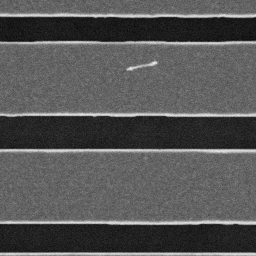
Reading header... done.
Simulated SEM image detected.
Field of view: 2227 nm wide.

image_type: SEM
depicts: lines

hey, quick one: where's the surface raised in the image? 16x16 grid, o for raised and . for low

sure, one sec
oooooooooooooooo
................
................
oooooooooooooooo
oooooooooooooooo
oooooooooooooooo
oooooooooooooooo
................
................
oooooooooooooooo
oooooooooooooooo
oooooooooooooooo
oooooooooooooooo
oooooooooooooooo
................
................